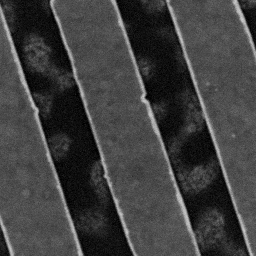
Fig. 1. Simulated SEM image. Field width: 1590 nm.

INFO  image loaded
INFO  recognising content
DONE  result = one or a few lines or trenches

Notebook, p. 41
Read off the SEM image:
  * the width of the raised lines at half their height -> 385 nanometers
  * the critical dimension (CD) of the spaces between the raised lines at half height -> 308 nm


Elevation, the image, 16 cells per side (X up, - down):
---XXXX----XXXX-
----XXXX---XXXX-
X---XXXX---XXXXX
X---XXXX----XXXX
X----XXXX---XXXX
XX---XXXX---XXXX
XX---XXXX----XXX
XX----XXXX---XXX
XXX---XXXX---XXX
XXX---XXXX----XX
XXX----XXXX---XX
XXXX---XXXX---XX
XXXX---XXXX----X
XXXX----XXXX---X
XXXXX---XXXX---X
-XXXX---XXXX----